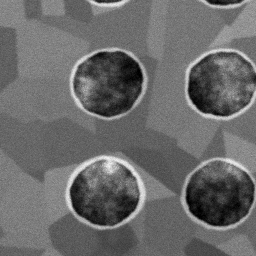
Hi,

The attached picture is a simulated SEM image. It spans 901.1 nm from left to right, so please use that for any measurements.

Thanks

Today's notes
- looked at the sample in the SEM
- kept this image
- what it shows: holes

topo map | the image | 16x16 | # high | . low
################
################
################
######..#####..#
#####....###....
#####....###....
#####...####....
################
################
################
#####...####...#
####.....###....
####.....###....
#####...####...#
################
################